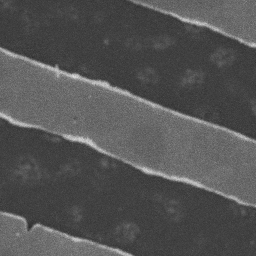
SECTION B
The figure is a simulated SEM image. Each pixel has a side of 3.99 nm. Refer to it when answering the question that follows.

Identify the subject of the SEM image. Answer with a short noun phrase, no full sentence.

one or a few lines or trenches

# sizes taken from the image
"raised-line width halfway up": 250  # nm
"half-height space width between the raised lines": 360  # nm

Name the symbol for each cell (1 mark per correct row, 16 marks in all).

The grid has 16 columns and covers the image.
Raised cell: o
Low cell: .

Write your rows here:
..........oooooo
............oooo
...............o
o...............
oooo............
ooooooo.........
oooooooooo......
.ooooooooooo....
....ooooooooooo.
.......ooooooooo
.........ooooooo
............oooo
...............o
o...............
oooo............
ooooooo.........